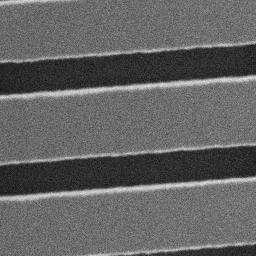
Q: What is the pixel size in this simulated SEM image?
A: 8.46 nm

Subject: lines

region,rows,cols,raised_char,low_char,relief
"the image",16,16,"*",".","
****************
****************
****************
******..........
................
......**********
****************
****************
****************
**********......
................
..........******
****************
****************
****************
*************...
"